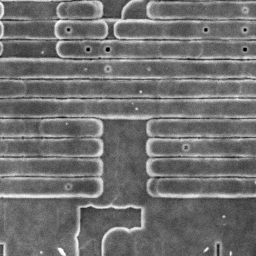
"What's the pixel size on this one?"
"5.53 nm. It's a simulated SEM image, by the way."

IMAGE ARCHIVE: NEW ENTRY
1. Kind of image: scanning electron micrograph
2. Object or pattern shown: wiring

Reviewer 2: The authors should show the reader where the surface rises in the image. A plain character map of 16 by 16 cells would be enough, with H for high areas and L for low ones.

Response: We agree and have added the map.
LLLLHHLLLHHHHHHH
LLLLHHLHHHHHHHHH
LLLLHHHHHHHHHHHH
LLLHHHHHHHHHHHHH
HHHHHHHHHHHHHHHH
HHHHHHHHHHHHHHHH
HHHHHHHHHHHHHHHH
HHHHHHHLLHHHHHHH
HHHHHHLLLHHHHHHH
HHHHHHLLLHHHHHHH
HHHHHHLLLHHHHHHH
HHHHHHLLLHHHHHHH
LLLLLLLLLLLLLLLL
LLLLLLLLLLLLLLLL
LLLLLLLLLLLLLLLL
LLLLLLLLLLLLLLLL